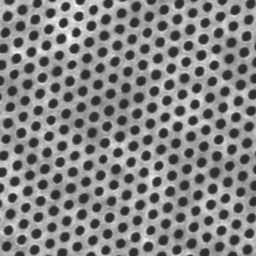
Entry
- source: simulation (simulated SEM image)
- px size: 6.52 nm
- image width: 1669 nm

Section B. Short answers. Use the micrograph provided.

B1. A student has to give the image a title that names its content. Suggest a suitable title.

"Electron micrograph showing a regular array of holes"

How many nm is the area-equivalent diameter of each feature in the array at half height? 64.6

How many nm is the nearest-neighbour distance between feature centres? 104